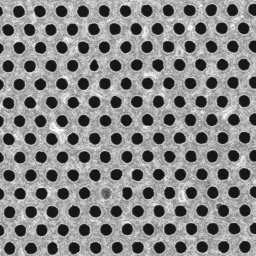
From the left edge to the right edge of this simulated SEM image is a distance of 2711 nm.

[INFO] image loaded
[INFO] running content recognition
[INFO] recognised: a regular array of holes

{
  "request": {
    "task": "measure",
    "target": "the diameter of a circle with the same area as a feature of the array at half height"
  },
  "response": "126 nanometres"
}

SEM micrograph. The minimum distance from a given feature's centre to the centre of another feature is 221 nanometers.